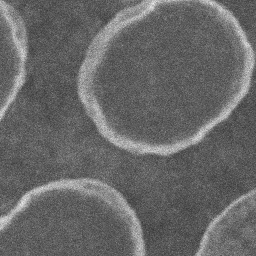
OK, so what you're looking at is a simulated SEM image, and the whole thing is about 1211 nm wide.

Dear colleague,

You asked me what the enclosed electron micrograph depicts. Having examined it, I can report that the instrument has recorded raised bodies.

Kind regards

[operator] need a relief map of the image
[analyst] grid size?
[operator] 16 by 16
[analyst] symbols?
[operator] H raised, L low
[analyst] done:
LLLLLLLLLHHHHHLL
HLLLLLLHHHHHHHHL
HLLLLLHHHHHHHHHL
HLLLLLHHHHHHHHHH
HLLLLHHHHHHHHHHH
HLLLLHHHHHHHHHHL
LLLLLLHHHHHHHHHL
LLLLLLHHHHHHHHLL
LLLLLLLHHHHHLLLL
LLLLLLLLLLLLLLLL
LLLLLLLLLLLLLLLL
LLLLLLLLLLLLLLLL
LLHHHHHLLLLLLLLL
LHHHHHHHLLLLLLLH
HHHHHHHHHLLLLLLL
HHHHHHHHHLLLLHLL